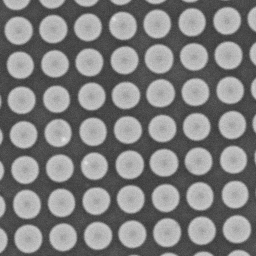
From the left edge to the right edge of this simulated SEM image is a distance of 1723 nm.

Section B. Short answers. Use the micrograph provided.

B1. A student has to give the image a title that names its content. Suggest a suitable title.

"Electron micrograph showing an array of small figures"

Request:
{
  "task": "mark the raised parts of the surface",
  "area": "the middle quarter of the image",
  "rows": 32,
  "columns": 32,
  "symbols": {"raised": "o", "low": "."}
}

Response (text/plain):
o..ooooooo..oooooo...oooooo...oo
o...ooooo....oooo.....oooo......
.....ooo........................
................................
......................oooo.....o
.....oooo....ooooo...oooooo...oo
....oooooo..ooooooo..ooooooo..oo
o...oooooo..ooooooo..ooooooo..oo
o...oooooo..ooooooo..oooooo...oo
o...oooooo..oooooo...oooooo...oo
o...ooooo....ooooo.....ooo......
................................
................................
..............ooo......oooo....o
o....ooooo...oooooo...oooooo..oo
o...oooooo...oooooo..ooooooo..oo
oo..oooooo...oooooo..ooooooo..oo
oo..ooooooo..oooooo...oooooo..oo
oo..oooooo...oooooo...ooooo....o
o....ooooo....ooo...............
................................
........................oo......
......ooo.....ooooo...oooooo...o
o....ooooo...ooooooo..oooooo..oo
oo..ooooooo..ooooooo..oooooo..oo
oo..ooooooo..ooooooo..oooooo...o
oo...oooooo..ooooooo..oooooo...o
oo...ooooo....ooooo....oooo.....
o.....ooo......ooo..............
................................
................o.......ooo.....
o.....oooo....ooooo....ooooo...o